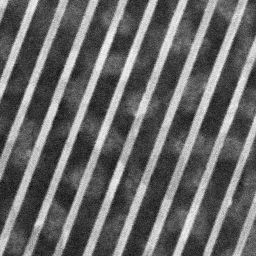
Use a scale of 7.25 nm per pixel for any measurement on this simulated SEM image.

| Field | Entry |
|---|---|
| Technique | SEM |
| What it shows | parallel lines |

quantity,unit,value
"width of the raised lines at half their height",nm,47.5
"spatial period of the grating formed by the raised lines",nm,203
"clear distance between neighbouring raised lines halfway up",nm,154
